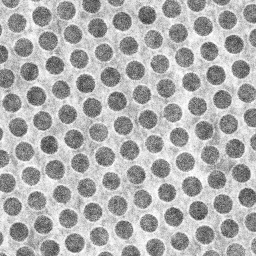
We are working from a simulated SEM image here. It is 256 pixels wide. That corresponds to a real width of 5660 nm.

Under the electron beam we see a regular array of holes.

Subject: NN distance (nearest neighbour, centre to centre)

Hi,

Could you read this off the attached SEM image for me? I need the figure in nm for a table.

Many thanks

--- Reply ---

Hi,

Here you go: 556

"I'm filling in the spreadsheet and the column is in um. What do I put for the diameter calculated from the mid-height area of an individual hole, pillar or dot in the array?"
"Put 0.453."